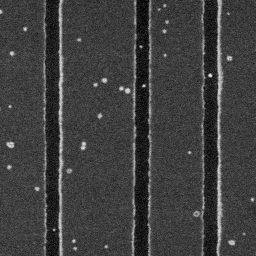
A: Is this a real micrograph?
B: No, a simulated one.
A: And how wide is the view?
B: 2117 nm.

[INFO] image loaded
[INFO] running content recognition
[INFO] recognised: lines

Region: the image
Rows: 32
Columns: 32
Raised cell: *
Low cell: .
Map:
******..*********..******..*****
******.**********..******..*****
******..*********..******..*****
******..*********..******..*****
******..*********..******..*****
******..*********..******..*****
******..*********..******..*****
******..*********..******..*****
******..*********..******..*****
******..*********..******..*****
******..*********..******..*****
******..*********..******..*****
******..*********..******..*****
******..*********..******..*****
******..*********..******..*****
******..*********..******..*****
******..*********..******..*****
******..*********..******..*****
******..*********..******..*****
******..*********..******..*****
******..*********..******..*****
******..*********..******..*****
******..*********..******..*****
******.**********..******..*****
******..*********..******..*****
******..*********..******..*****
******..*********..******..*****
******..*********..******..*****
******..*********..******..*****
******..*********..******..*****
******..*********..******..*****
******..*********..******..*****